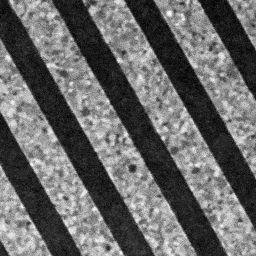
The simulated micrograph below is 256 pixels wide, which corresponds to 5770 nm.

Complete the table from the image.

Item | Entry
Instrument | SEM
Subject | one or a few lines or trenches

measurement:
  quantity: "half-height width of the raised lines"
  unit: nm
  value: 810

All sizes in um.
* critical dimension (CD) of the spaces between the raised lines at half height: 0.614